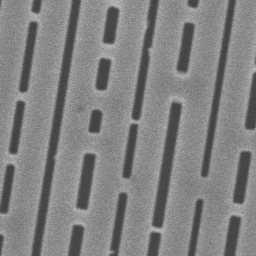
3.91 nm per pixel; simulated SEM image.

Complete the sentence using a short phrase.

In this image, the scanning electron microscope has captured parallel lines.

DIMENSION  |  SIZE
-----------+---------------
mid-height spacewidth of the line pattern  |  36.6 nm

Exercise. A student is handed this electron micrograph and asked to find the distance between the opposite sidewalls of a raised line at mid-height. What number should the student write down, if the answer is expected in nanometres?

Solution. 110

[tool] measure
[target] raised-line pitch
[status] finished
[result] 150 nm